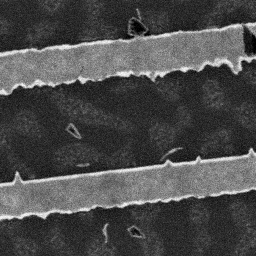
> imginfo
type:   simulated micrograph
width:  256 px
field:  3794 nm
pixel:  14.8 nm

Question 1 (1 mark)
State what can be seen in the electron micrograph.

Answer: one or a few lines or trenches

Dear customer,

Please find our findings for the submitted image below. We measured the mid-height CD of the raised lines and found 521 nm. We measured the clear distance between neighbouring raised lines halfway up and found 1.38 microns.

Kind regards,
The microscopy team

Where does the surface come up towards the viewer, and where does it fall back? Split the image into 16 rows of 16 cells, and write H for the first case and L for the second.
LLLLLLLLLLLLLLLL
LLLLLLLLHLLLLLLL
LLLLLLLLHHHHHHHH
HHHHHHHHHHHHHHHH
HHHHHHHHHHHLLLLL
HLLLLLLLLLLLLLLL
LLLLLLLLLLLLLLLL
LLLLLLLLLLLLLLLL
LLLLLLLLLLLLLLLL
LLLLLLLLLLLLLLLL
LLLLLLLLLHHHHHHH
HHHHHHHHHHHHHHHH
HHHHHHHHHHLLLLLL
HLLLLLLLLLLLLLLL
LLLLLLLLLLLLLLLL
LLLLLLLLLLLLLLLL